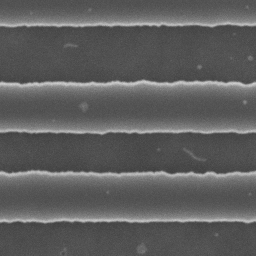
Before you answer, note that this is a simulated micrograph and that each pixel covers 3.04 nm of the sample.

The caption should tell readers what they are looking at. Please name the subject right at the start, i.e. lines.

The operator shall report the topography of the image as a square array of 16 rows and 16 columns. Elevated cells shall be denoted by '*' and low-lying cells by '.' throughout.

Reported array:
****************
****************
................
................
................
****************
****************
****************
................
................
................
****************
****************
****************
................
................